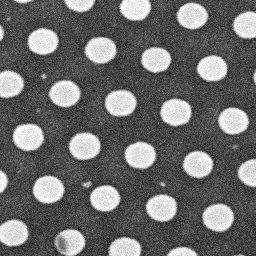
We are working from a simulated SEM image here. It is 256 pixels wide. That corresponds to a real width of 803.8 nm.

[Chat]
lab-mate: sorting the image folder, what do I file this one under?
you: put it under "a regular array of raised bodies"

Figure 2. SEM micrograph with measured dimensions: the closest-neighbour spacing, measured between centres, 176 nanometers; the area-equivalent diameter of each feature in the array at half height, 86 nm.